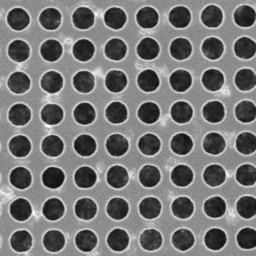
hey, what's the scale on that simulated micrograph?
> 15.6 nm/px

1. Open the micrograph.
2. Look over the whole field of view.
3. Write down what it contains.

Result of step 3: a regular array of holes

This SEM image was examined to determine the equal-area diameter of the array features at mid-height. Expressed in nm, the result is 351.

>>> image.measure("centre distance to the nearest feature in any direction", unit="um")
0.494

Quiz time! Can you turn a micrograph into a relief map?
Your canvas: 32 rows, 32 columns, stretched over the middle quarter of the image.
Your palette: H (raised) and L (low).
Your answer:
HHHHHHHHHHHHHHHHHHHHHHHHHHHHHHHH
HHHHHHHHHHHHLHHHHHHHLLHHHHHHHLHH
HHHLLLLHHHHLLLLHHHHLLLLHHHHLLLLL
HHLLLLLLHHLLLLLLHHLLLLLLHHLLLLLL
HHLLLLLLHHLLLLLLHHLLLLLLHHLLLLLL
HHLLLLLLHHLLLLLLHHHLLLLLHHHLLLLL
HHHLLLLHHHHLLLLHHHHHLLLHHHHLLLLH
HHHHHHHHHHHHHHHHHHHHHHHHHHHHHHHH
HHHHHHHHHHHHHHHHHHHHHHHHHHHHHHHH
HHHHHHHHHHHHLLHHHHHHHHHHHHHHLLHH
HHHLLLLHHHHLLLLHHHHLLLLLHHHLLLLL
HHLLLLLLHHHLLLLLHHLLLLLLHHHLLLLL
HHLLLLLLHHLLLLLLHHLLLLLLHHHLLLLL
HHLLLLLLHHHLLLLLHHHLLLLLHHHLLLLL
HHHLLLLHHHHLLLLHHHHHLLLHHHHHLLLH
HHHHHHHHHHHHHHHHHHHHHHHHHHHHHHHH
HHHHHHHHHHHHHHHHHHHHHHHHHHHHHHHH
HHHHHHHHHHHHHHHHHHHHLLHHHHHHHLHH
HHHLLLLHHHHLLLLLHHHLLLLHHHHLLLLL
HHHLLLLLHHLLLLLLHHHLLLLLHHHLLLLL
HHLLLLLLHHLLLLLLHHHLLLLLHHLLLLLL
HHHLLLLLHHHLLLLLHHHLLLLLHHHLLLLL
HHHHLLLHHHHLLLLHHHHHLLLHHHHHLLLH
HHHHHHHHHHHHHHHHHHHHHHHHHHHHHHHH
HHHHHHHHHHHHHHHHHHHHHHHHHHHHHHHH
HHHHHHHHHHHHLLHHHHHHLLHHHHHHLLLH
HHHLLLLHHHHLLLLLHHHLLLLLHHHLLLLL
HHHLLLLLHHHLLLLLHHHLLLLLHHHLLLLL
HHLLLLLLHHHLLLLLHHHLLLLLHHHLLLLL
HHHLLLLLHHHLLLLLHHHLLLLLHHHLLLLL
HHHLLLLHHHHHLLLHHHHHLLLHHHHHLLLH
HHHHHHHHHHHHHHHHHHHHHHHHHHHHHHHH